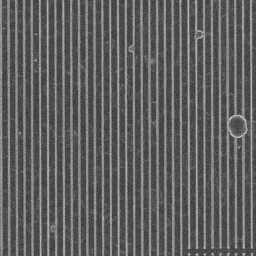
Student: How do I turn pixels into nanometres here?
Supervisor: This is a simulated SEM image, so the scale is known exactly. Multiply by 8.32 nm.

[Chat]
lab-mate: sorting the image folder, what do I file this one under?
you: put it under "parallel lines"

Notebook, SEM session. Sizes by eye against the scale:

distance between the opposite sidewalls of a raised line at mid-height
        14.6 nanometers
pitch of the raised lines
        0.0651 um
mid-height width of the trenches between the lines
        49.9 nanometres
